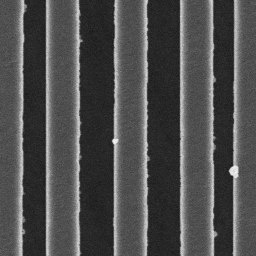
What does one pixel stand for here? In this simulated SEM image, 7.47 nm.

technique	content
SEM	lines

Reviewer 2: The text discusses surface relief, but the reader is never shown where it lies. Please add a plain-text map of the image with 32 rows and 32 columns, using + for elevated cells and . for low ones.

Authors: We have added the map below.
+++...++++....++++.....++++..+++
+++...++++....++++.....++++..+++
+++...++++....++++.....++++..+++
+++...++++....++++.....++++..+++
+++...++++....++++.....++++..+++
+++...++++....++++.....++++..+++
+++...++++....++++.....++++..+++
+++...++++....++++.....++++..+++
+++...++++....++++.....++++..+++
+++...++++....++++.....++++..+++
+++...++++....++++.....++++..+++
+++...++++....++++.....++++..+++
+++...++++....++++.....++++..+++
+++...++++....++++.....++++..+++
+++...++++....++++.....++++..+++
+++...++++....++++.....++++..+++
+++...++++....++++.....++++..+++
+++...++++....++++.....++++..+++
+++...++++....++++.....++++..+++
+++...++++....++++.....++++..+++
+++...++++....++++.....++++..+++
+++...++++....++++.....++++..+++
+++...++++....++++.....++++..+++
+++...++++....++++.....++++..+++
+++...++++....++++.....++++..+++
+++...++++....++++.....++++..+++
+++...++++....++++.....++++..+++
+++...++++....++++.....++++..+++
+++...++++....++++.....++++..+++
+++...++++....++++.....++++..+++
+++...++++....++++.....++++..+++
+++...++++....++++.....++++..+++